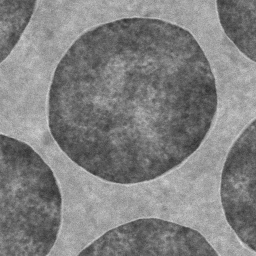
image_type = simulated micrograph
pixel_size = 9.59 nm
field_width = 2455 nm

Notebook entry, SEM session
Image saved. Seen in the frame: holes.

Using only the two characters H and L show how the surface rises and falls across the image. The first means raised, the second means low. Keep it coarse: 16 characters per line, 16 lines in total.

LLHHHHHHHHHHHHLL
LLHHHHLLLLLHHHLL
LHHHHLLLLLLLHHLL
HHHHLLLLLLLLLHHL
HHHLLLLLLLLLLHHH
HHHLLLLLLLLLLHHH
HHHLLLLLLLLLLLHH
HHHLLLLLLLLLLHHH
HHHLLLLLLLLLLHHL
LLHHLLLLLLLLHHLL
LLLHHLLLLLLHHHLL
LLLLHHHHHHHHHHLL
LLLLHHHHHHHHHHLL
LLLLHHHHHHHHHHLL
LLLLHHHLLLLLHHHL
LLLHHLLLLLLLLHHH